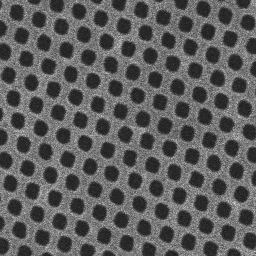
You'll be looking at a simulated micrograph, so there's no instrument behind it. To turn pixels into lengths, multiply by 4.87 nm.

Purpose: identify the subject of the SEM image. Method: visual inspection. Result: a regular array of holes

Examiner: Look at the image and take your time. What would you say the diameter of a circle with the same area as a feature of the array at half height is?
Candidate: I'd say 73.3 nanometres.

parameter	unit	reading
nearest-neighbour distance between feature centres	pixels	23.1